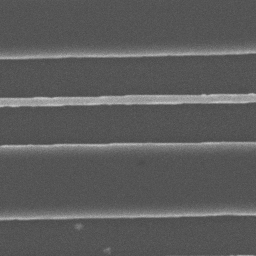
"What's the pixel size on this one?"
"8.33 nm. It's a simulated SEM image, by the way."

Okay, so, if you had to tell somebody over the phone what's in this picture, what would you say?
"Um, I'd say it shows lines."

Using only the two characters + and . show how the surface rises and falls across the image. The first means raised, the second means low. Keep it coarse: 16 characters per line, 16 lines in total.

++++++++++++++++
++++++++++++++++
++++++++++++++++
+++++++.........
................
................
+.++............
................
................
++++++++++++++++
++++++++++++++++
++++++++++++++++
++++++++++++++++
++++++++++......
................
................